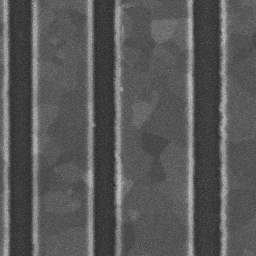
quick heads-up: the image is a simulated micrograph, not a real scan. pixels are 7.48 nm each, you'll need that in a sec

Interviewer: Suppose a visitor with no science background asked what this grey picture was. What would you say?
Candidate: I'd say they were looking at one or a few lines or trenches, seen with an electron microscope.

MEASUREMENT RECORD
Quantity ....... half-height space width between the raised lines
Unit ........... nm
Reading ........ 222